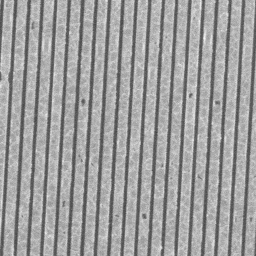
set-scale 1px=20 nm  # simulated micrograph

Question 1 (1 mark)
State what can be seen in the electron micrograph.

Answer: parallel lines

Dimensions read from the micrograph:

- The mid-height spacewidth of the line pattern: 79.8 nanometers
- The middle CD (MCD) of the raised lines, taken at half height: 184 nm